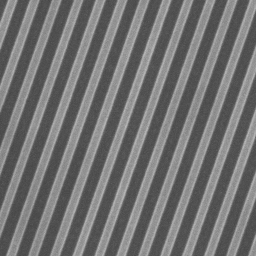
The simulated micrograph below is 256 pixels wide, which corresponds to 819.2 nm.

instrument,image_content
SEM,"parallel lines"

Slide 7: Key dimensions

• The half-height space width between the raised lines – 41.2 nm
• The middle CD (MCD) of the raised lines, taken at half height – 0.0264 microns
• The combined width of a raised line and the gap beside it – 66.4 nanometers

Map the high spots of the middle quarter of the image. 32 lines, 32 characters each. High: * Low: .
..**....**...**....**...**....**
..**....**...**....**...**....**
..**...**....**...**....**...**.
.**....**...**....**...**....**.
.**...***...**...***...**....*..
.**...**....**...**....**...**..
**....**...**....**...**....**..
**...***...**...**....**...**...
**...**...***...**...***...**...
*...***...**....**...**....**...
*...***...**...**....**...**....
*...**...***...**...***...**...*
....**...**....**...**....**...*
...***...**...**....**...**....*
...**...***...**...***...**...**
...**...**....**...**....**...**
..**....**...**....**...**....**
..**...***...**...***...**...***
..**...**....**...**....**...**.
.**....**...**....**...**....**.
.**...**....**...**....**...**..
***...**....**...**....**...**..
**....**...**....**...**....**..
**...**....**...**....**...**...
**...**...***...**....*....**...
*....**...**....**...**....**...
*...**....**...**....**...**....
*...**...**....**...**....**...*
...***...**...***...**...***...*
...**....**...**....**...**....*
...**...**....**...**....**...**
..***...**...***...**...***...**